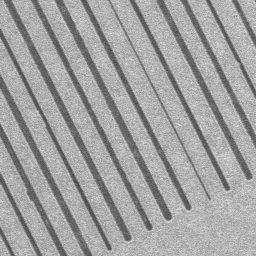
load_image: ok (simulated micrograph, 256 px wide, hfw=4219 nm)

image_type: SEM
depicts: parallel lines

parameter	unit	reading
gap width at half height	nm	125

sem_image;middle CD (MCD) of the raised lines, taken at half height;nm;250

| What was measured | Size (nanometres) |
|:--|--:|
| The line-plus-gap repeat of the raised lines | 367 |